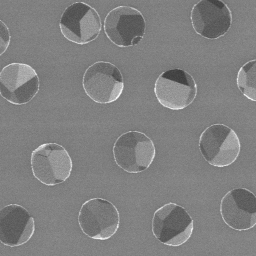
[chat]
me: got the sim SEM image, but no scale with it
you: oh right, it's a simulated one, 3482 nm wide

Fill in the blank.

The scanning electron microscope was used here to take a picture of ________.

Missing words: a regular array of raised bodies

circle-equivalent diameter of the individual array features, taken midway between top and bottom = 40.3 px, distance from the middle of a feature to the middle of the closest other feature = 947 nm